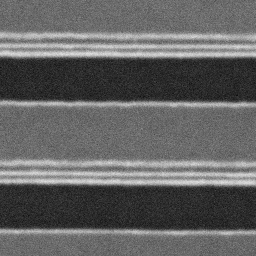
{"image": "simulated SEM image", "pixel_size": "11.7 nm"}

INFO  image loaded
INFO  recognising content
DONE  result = lines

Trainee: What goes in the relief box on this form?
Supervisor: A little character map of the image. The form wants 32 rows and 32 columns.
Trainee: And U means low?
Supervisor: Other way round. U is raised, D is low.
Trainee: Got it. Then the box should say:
UUUUUUUUUUUUUUUUUUUUUUUUUUUUUUUU
UUUUUUUUUUUUUUUUUUUUUUUUUUUUUUUU
UUUUUUUUUUUUUUUUUUUUUUUUUUUUUUUU
UUUUUUUUUUUUUUUUUUUUUUUUUUUUUUUU
UUUUUUUUUUUUUUUUUUUUUUUUUUUUUUUU
UUUUUUUUUUUUUUUUUUUUUUUUUUUUUUUU
UUUUUUUUUUUUUUUUUUUUUUUUUUUUUUUU
DDDDDDDDDDDDDDDDDDDDDDDDDDDDDDDD
DDDDDDDDDDDDDDDDDDDDDDDDDDDDDDDD
DDDDDDDDDDDDDDDDDDDDDDDDDDDDDDDD
DDDDDDDDDDDDDDDDDDDDDDDDDDDDDDDD
DDDDDDDDDDDDDDDDDDDDDDDDDDDDDDDD
DDDDDDDDDDDDDDDDDDDDDDDDDDDDDDDD
UUUUUUUUUUUUUUUUUUUUUUUUUUUUUUUU
UUUUUUUUUUUUUUUUUUUUUUUUUUUUUUUU
UUUUUUUUUUUUUUUUUUUUUUUUUUUUUUUU
UUUUUUUUUUUUUUUUUUUUUUUUUUUUUUUU
UUUUUUUUUUUUUUUUUUUUUUUUUUUUUUUU
UUUUUUUUUUUUUUUUUUUUUUUUUUUUUUUU
UUUUUUUUUUUUUUUUUUUUUUUUUUUUUUUU
UUUUUUUUUUUUUUUUUUUUUUUUUUUUUUUU
UUUUUUUUUUUUUUUUUUUUUUUUUUUUUUUU
UUUDUUUUUUUUUUUUUUUUUUUUUUUUUUUU
DDDDDDDDDDDDDDDDDDDDDDDDDDDDDDDD
DDDDDDDDDDDDDDDDDDDDDDDDDDDDDDDD
DDDDDDDDDDDDDDDDDDDDDDDDDDDDDDDD
DDDDDDDDDDDDDDDDDDDDDDDDDDDDDDDD
DDDDDDDDDDDDDDDDDDDDDDDDDDDDDDDD
DDDDDDDDDDDDDDDDDDDDDDDDDDDDDDDD
UUUUUUUUUUUUUUUUUUUUUUUUUUUUUUUU
UUUUUUUUUUUUUUUUUUUUUUUUUUUUUUUU
UUUUUUUUUUUUUUUUUUUUUUUUUUUUUUUU